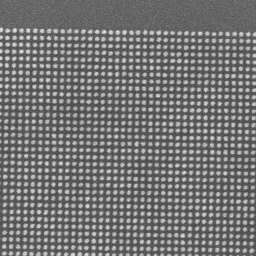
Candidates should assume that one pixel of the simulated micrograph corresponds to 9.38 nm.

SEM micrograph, a regular array of raised bodies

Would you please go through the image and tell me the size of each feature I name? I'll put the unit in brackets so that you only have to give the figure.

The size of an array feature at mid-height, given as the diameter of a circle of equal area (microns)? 0.0367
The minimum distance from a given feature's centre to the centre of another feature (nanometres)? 62.2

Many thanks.